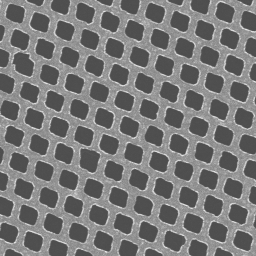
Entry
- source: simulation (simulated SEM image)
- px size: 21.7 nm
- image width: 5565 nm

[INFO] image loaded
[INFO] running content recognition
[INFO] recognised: a regular array of holes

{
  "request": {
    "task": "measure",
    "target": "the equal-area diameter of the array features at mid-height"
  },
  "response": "19.3 pixels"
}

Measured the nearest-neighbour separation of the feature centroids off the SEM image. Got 570 nanometres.